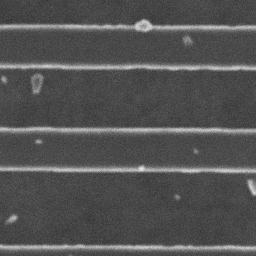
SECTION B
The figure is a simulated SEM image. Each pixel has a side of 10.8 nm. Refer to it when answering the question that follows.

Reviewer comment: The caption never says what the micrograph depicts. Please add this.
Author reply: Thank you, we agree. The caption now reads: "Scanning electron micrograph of lines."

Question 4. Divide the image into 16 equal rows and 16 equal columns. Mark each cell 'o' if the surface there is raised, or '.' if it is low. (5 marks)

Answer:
................
........o.......
oooooooooooooooo
oooooooooooooooo
................
................
................
................
oooooooooooooooo
oooooooooooooooo
oooooooooooooooo
................
................
................
................
oooooooooooooooo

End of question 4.